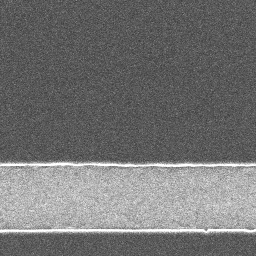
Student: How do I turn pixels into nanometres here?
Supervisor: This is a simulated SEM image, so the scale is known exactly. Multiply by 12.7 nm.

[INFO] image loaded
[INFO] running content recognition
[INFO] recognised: one or a few lines or trenches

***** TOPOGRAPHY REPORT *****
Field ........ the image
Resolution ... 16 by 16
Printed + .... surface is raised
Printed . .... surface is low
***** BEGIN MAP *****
++++++++++++++++
++++++++++++++++
++++++++++++++++
++++++++++++++++
++++++++++++++++
++++++++++++++++
++++++++++++++++
++++++++++++++++
++++++++++++++++
++++++++++++++++
................
................
................
................
++++++++++++++++
++++++++++++++++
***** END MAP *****